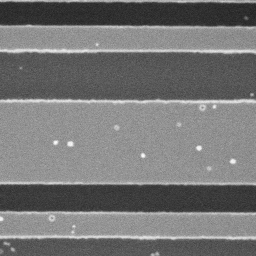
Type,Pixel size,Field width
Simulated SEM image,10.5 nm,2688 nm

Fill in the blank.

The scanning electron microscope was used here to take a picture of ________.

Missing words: lines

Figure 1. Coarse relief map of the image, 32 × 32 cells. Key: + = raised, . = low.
................................
................................
................................
++++++++++++++++++++++++++++++++
++++++++++++++++++++++++++++++++
++++++++++++++++++++++++++++++++
................................
................................
................................
................................
................................
................................
................................
++++++++++++++++++++++++++++++++
++++++++++++++++++++++++++++++++
++++++++++++++++++++++++++++++++
++++++++++++++++++++++++++++++++
++++++++++++++++++++++++++++++++
++++++++++++++++++++++++++++++++
++++++++++++++++++++++++++++++++
++++++++++++++++++++++++++++++++
++++++++++++++++++++++++++++++++
++++++++++++++++++++++++++++++++
................................
................................
................................
................................
++++++++++++++++++++++++++++++++
++++++++++++++++++++++++++++++++
++++++++++++++++++++++++++++++++
................................
................................